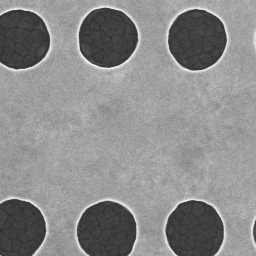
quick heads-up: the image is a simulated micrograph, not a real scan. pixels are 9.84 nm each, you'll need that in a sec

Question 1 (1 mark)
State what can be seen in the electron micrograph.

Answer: holes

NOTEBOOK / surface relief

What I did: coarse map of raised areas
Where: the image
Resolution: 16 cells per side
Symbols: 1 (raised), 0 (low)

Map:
1111111111111111
0001100011100011
0001100001100011
0001100011100011
1111111111111111
1111111111111111
1111111111111111
1111111111111111
1111111111111111
1111111111111111
1111111111111111
1111111111111111
1111111111111111
0001100011100011
0001100011000011
0011100011100011